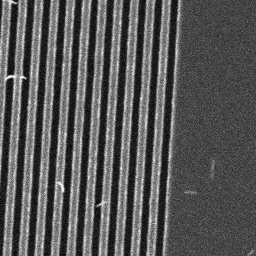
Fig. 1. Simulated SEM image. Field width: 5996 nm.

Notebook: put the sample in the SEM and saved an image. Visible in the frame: parallel lines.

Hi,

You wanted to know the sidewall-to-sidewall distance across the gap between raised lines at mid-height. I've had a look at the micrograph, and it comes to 178 nm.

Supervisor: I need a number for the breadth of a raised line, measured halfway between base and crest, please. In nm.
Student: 199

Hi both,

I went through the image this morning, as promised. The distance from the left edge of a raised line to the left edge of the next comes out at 373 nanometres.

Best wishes